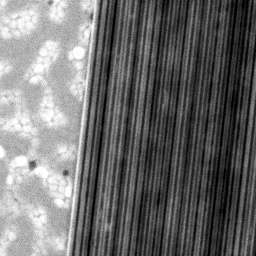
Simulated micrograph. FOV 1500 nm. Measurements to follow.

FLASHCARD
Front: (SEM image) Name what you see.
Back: parallel lines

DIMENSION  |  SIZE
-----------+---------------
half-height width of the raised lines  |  0.0254 micrometres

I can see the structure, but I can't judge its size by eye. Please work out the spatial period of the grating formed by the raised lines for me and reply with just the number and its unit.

0.0461 micrometres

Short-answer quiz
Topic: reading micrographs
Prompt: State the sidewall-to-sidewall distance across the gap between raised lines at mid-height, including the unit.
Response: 0.0203 um